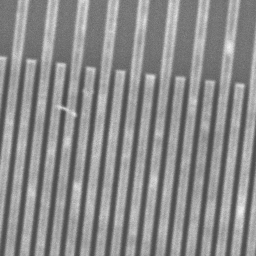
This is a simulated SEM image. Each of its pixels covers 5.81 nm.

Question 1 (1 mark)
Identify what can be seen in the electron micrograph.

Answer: parallel lines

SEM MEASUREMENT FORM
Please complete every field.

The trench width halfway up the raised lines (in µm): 0.0368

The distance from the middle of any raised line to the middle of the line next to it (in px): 15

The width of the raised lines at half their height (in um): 0.0527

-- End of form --